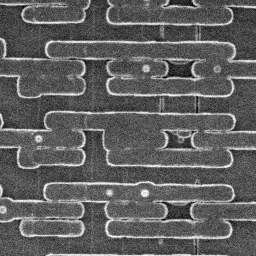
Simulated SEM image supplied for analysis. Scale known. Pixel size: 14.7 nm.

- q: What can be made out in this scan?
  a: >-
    wiring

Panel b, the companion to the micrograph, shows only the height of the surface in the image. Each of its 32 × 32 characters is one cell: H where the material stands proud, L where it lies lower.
LLHHHHHHHHHLLLHHHHHHHLLLHHHHHHHH
LLLHHHHHHHHLLHHHHHHHHHHHHHHHHLLL
LLLHHHHHHHLLLLHHHHHHHHHHHHHHHLLL
LLLLLLLLLLLLLLLLLLLLLLLLLLLLLLLL
LLLLLLLLLLLLLLLLLLLLLLLLLLLLLLLL
HLLLLLHHHHHHHHHHHHHHHHHHHHHHHLLL
HLLLLLHHHHHHHHHHHHHHHHHHHHHHHLLL
HHHHHHHHHHHLLHHHHHHHHLLLHHHHHHLL
HHHHHHHHHHHLLHHHHHHHHLLLHHHHHHHH
LLHHHHHHHHLLLLHHHHHHHLLLHHHHHHHH
LLHHHHHHHHHLLHHHHHHHHHHHHHHHHLLL
LLHHHHHHHHLLLLHHHHHHHHHHHHHHHLLL
LLLLLLLLLLLLLLLLLLLLLLLLLLLLLLLL
LLLLLLLLLLLLLLLLLLLLLLLLLLLLLLLL
LLLLLLHHHHHHHHHHHHHHHHHHHHHHHLLL
LLLLLLHHHHHHHHHHHHHHHHHHHHHHHLLL
HHHHHHHHHHHLLHHHHHHHHLLLHHHHHHHH
HHHHHHHHHHHLLHHHHHHHHLLLHHHHHHHH
LLHHHHHHHHLLLHHHHHHHHLLLHHHHHHHH
LLHHHHHHHHHLLHHHHHHHHHHHHHHHHLLL
LLHHHHHHHHLLLLHHHHHHHHHHHHHHHLLL
LLLLLLLLLLLLLLLLLLLLLLLLLLLLLLLL
LLLLLLLLLLLLLLLLLLLLLLLLLLLLLLLL
LLLLLLHHHHHHHHHHHHHHHHHHHHHHHLLL
LLLLLLHHHHHHHHHHHHHHHHHHHHHHHLLL
HHHHHHHHHHLLLHHHHHHHHLLLHHHHHHHH
HHHHHHHHHHLLLHHHHHHHHLLLHHHHHHHH
HHHHHHHHHHLLLLHHHHHHHLHLHHHHHLLH
LLLHHHHHHHLLLHHHHHHHHHHHHHHHHLLL
LLLHLLLLHHLLLLHHHHHHHHHHHHHHLLLL
LLLLLLLLLLLLLLLLLLLLLLLLLLLLLLLL
LLLLLLLLLLLLLLLLLLLLLLLLLLLLLLLL